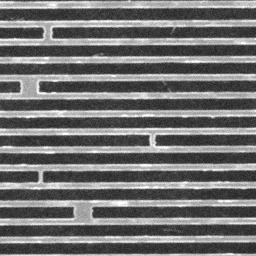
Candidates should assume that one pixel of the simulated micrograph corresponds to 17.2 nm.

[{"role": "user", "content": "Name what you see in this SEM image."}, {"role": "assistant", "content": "parallel lines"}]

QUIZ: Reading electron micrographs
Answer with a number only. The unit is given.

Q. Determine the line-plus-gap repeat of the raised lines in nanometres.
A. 312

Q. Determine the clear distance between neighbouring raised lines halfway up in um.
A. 0.211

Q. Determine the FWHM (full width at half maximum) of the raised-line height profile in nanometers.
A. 99.2